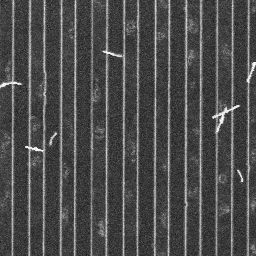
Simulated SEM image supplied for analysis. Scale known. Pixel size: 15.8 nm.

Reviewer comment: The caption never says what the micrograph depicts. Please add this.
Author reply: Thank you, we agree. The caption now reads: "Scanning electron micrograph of parallel lines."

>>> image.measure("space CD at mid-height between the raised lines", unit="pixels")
16.6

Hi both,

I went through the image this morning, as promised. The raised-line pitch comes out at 494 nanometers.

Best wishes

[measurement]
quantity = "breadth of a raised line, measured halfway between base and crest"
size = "231 nm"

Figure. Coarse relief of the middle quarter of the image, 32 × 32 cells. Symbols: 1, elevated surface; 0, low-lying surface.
11100001111000011100000111000001
11100001111000011100000111000001
11100001111000011100000111000001
11100001111000011100000111000001
11100001111000011100000111000001
11100001111000011100000111000001
11100001111000011100000111000001
11100001111000011100000111000001
11100001110000011100000111000001
11100001110000011100000111000001
11100001110000011100000111000001
11100001110000011100000111000001
11100001110000011100000111000001
11100001110000011100000111000001
11100001110000011100000111000001
11100001110000011100000111000001
11100001110000011100000111000001
11100001110000011100000111000001
11100001110000011100000111000011
11100001110000011100000111000011
11100001110000011100000111000011
11100001110000011100000111000011
11100001110000011100000111000011
11100001110000011100000111000011
11100001110000011100000111000011
11100001110000011100000111000011
11100001110000011100000111000011
11100001110000011100000111000011
11100001110000011100000111000011
11100001110000011100000111000011
11100001110000011100000111000011
11100001110000011100000111000011